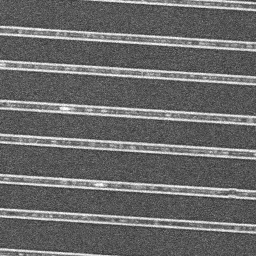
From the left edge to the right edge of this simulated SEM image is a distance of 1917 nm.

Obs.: parallel lines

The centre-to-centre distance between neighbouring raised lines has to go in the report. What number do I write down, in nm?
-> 273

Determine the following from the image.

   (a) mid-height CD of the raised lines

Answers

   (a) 53.2 nm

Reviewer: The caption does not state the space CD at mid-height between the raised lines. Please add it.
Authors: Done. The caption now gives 220 nanometers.